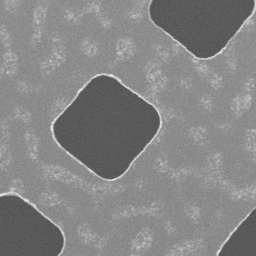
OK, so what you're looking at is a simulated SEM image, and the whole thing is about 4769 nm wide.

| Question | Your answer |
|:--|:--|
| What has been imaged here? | holes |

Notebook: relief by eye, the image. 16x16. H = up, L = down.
HHHHHHHHHLLLLLLL
HHHHHHHHHHLLLLLH
HHHHHHHHHHHLLLHH
HHHHHHHHHHHHLHHH
HHHHHHHHHHHHHHHH
HHHHHLLLHHHHHHHH
HHHHLLLLLHHHHHHH
HHHHLLLLLLHHHHHH
HHHLLLLLLLHHHHHH
HHHHLLLLLHHHHHHH
HHHHHHLLHHHHHHHH
HHHHHHHHHHHHHHHH
LHHHHHHHHHHHHHHH
LLLHHHHHHHHHHHHH
LLLLHHHHHHHHHHHL
LLLLHHHHHHHHHHLL